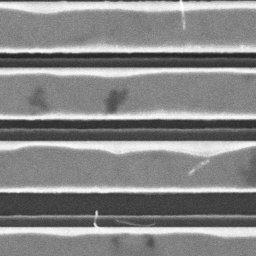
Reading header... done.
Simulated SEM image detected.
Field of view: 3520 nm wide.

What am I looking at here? lines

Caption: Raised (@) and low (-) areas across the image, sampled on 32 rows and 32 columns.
@@@@@@@@@@@@@@@@@@@@@@@@@@@@@@@@
@@@@@@@@@@@@@@@@@@@@@@@@@@@@@@@@
@@@@@@@@@@@@@@@@@@@@@@@@@@@@@@@@
@@@@@@@@@@@@@@@@@@@@@@@@@@@@@@@@
@@@@@@@@@@@@@@@@@@@@@@@@@@@@@@@@
@@@@@@@@@@@@@@@@@@@@@@@@@@@@@@@@
@@@@@@@--@----------------------
--------------------------------
--------------------------------
@@@@@@@@@@@@@@@@@@@@@@@@@@@@@@@@
@@@@@@@@@@@@@@@@@@@@@@@@@@@@@@@@
@@@@@@@@@@@@@@@@@@@@@@@@@@@@@@@@
@@@@@@@@@@@@@@@@@@@@@@@@@@@@@@@@
@@@@@@@@@@@@@@@@@@@@@@@@@@@@@@@@
@@@@@@@@@@@@@@@@@@@@@@@@@@@@@@@@
--------------------------------
--------------------------------
--------------------------------
@@@@@@@@@@@@@@@@@@@@@@@@@@@@@@@@
@@@@@@@@@@@@@@@@@@@@@@@@@@@@@@@@
@@@@@@@@@@@@@@@@@@@@@@@@@@@@@@@@
@@@@@@@@@@@@@@@@@@@@@@@@@@@@@@@@
@@@@@@@@@@@@@@@@@@@@@@@@@@@@@@@@
@@@@@@@@@@@@@@@@@@@@@@@@@@@@@@@@
--------------------------------
--------------------------------
--------------------------------
--------------------------------
------------@-------------------
@@@@@@@@@@@@@@@@@@@@@@@@@@@@@@@@
@@@@@@@@@@@@@@@@@@@@@@@@@@@@@@@@
@@@@@@@@@@@@@@@@@@@@@@@@@@@@@@@@